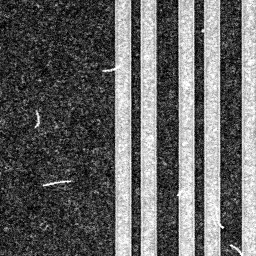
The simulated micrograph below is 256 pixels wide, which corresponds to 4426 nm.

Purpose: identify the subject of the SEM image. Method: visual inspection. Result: parallel lines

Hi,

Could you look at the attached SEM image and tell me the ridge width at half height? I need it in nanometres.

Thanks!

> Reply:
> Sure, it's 257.